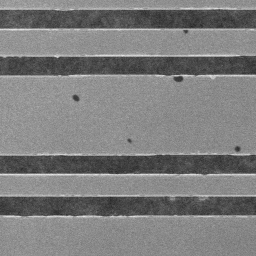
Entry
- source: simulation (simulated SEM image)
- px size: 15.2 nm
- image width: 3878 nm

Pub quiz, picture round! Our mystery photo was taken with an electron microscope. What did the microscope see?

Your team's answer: lines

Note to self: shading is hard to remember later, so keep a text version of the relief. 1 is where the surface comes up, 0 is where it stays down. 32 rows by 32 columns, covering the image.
11111111111111111111111111111111
00000000000000000000000000000000
00000000000000000000000000000000
00000000000000000000000000000000
11111111111111111111111111111111
11111111111111111111111111111111
11111111111111111111111111111111
00000000000000000000000000000000
00000000000000000000000000000000
00000001111111111111111111111111
11111111111111111111111111111111
11111111111111111111111111111111
11111111111111111111111111111111
11111111111111111111111111111111
11111111111111111111111111111111
11111111111111111111111111111111
11111111111111111111111111111111
11111111111111111111111111111111
11111111111111111111111111111111
00000000000000000000000000000000
00000000000000000000000000000000
00000000000000000000000000000000
11111111111111111111111111111111
11111111111111111111111111111111
00000000000000000000000000000000
00000000000000000000000000000000
00000000000000000000000000000000
11111111111111111111111111111111
11111111111111111111111111111111
11111111111111111111111111111111
11111111111111111111111111111111
11111111111111111111111111111111